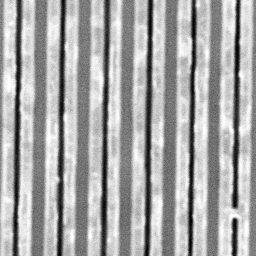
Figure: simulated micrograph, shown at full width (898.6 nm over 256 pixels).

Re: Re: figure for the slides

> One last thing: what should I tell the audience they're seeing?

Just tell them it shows parallel lines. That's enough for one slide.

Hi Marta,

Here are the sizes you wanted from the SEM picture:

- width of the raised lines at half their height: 38.1 nm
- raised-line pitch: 75 nm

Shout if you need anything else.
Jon